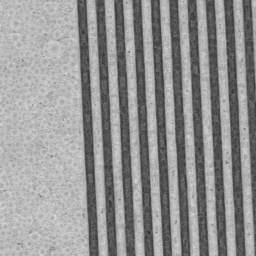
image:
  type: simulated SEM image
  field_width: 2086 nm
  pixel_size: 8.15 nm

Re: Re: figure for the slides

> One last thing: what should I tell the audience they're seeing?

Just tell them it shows parallel lines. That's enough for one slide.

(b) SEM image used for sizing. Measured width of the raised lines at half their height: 0.0753 µm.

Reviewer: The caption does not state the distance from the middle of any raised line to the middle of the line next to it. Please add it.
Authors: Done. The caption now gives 149 nm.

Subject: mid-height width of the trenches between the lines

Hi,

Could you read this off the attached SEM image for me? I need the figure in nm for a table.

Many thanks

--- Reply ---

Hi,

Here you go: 75.3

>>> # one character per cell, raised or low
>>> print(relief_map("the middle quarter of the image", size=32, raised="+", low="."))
++++...++..++...++..++...++...+.
++++..+++..++...++..++...++...++
++++...++..++...++..+++..++...++
++++...++..++...++..+++..++...++
++++...++..++...++...++..++...++
++++...++..++...++...++..++...++
++++...++..++...++..+++..++...++
++++...++..++...++..+++..++...++
++++...++..+++..++...++..++...++
++++...++..+++..++...++..++...++
++++...++...++..++...++..++...++
++++...++...++..++...++...+...++
++++...++...++..++...++..++...++
+++++..++...++..++...++..++...++
+++++..++...++..++...++..+++..++
+++++..++...++..+++..++..+++..++
+++++..++...++..+++..++...++..++
+++++..++...++...++..++...++..++
+++++...+...++...++..++...++..++
+++++..++...++...++..++...++..++
+++++..++...++...++..++...++..++
+++++..+++..++...++..++...++..++
+++++..+++..++...++..++...++..++
+++++...++..++...++..++...++...+
+++++...++..++...++...+...++...+
+++++...++..++...++...++..++...+
+++++...++..++...++...++..++...+
+++++...++..++...++...++..++...+
+++++...++..+++..++...++..++...+
++++++..++..+++..++...++..++...+
++++++..++...++..++...++..++...+
++++++..++...++..++...++..++...+